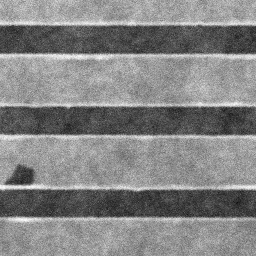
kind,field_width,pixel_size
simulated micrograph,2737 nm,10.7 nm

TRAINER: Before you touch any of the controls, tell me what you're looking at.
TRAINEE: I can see one or a few lines or trenches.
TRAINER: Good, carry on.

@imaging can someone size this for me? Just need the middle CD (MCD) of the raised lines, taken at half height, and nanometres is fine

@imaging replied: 543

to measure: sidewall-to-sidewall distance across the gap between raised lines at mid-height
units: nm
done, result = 325